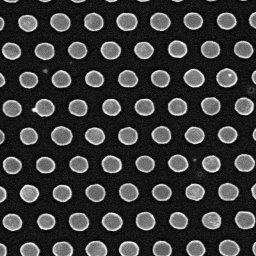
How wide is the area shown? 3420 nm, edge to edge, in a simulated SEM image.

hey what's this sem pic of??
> a regular array of raised bodies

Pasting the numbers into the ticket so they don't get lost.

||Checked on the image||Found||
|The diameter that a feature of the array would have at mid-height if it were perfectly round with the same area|236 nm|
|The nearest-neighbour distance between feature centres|435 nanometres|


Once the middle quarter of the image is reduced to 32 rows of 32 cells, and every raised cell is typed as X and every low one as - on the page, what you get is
--------------------------------
--------------------------------
X-----XXX-----XXXX----XXXX----XX
XX----XXXX----XXXX----XXXX----XX
XX----XXXX----XXXX----XXXX----XX
X------XX------XX------XXX------
--------------------------------
--------------------------------
--------------------------------
--XXX-----XXX-----XXXX-----XXX--
-XXXXX----XXXX----XXXX----XXXXX-
-XXXXX----XXXX----XXXX----XXXXX-
--XXX------XX------XX------XXX--
--------------------------------
--------------------------------
--------------------------------
X-----XXX-----XXX------XXX-----X
XX----XXXX----XXXX----XXXXX---XX
XX----XXXX----XXXX----XXXXX---XX
X------XX------XXX-----XXX-----X
--------------------------------
--------------------------------
--------------------------------
--XXX-----XXX------XXX-----XXX--
--XXXX----XXXX----XXXX----XXXXX-
--XXXX----XXXX----XXXX----XXXXX-
--XXXX----XXXX-----XXX------XX--
--------------------------------
--------------------------------
--------------------------------
-------XX-----XXXX-----XX------X
XX----XXXX----XXXX----XXXXX----X